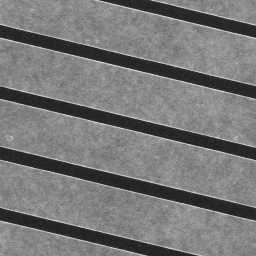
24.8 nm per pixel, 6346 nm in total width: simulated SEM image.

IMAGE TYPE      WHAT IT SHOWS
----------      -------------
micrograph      parallel lines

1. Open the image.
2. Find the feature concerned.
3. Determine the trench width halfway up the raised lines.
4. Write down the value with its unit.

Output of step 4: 12.4 px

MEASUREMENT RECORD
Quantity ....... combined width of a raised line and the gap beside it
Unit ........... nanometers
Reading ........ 1470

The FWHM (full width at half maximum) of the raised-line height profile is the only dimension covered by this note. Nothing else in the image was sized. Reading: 1160 nanometres